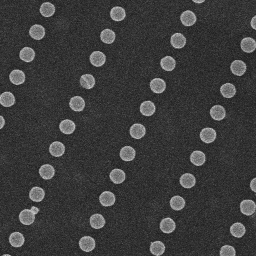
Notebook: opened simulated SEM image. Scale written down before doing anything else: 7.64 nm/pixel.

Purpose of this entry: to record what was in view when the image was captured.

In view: a regular array of raised bodies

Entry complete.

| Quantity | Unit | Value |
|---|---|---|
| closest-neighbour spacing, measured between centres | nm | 187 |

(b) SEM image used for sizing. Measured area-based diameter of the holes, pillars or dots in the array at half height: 114 nm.